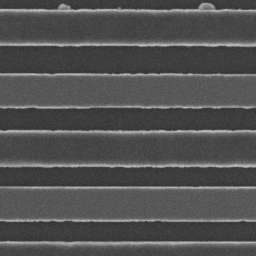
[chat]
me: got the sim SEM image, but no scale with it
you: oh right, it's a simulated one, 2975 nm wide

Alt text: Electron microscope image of lines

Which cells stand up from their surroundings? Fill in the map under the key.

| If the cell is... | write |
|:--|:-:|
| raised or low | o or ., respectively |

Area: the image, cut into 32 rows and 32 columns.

................................
oooooooooooooooooooooooooooooooo
oooooooooooooooooooooooooooooooo
oooooooooooooooooooooooooooooooo
oooooooooooooooooooooooooooooooo
oooooooooooooooooooooooooooooooo
................................
................................
................................
oooooooooooooooooooooooooooooooo
oooooooooooooooooooooooooooooooo
oooooooooooooooooooooooooooooooo
oooooooooooooooooooooooooooooooo
................................
................................
................................
oooooooooooooooooooooooooooooooo
oooooooooooooooooooooooooooooooo
oooooooooooooooooooooooooooooooo
oooooooooooooooooooooooooooooooo
oooooooooooooooooooooooooooooooo
................................
................................
ooooooooooooooooooo.oooo.ooooooo
oooooooooooooooooooooooooooooooo
oooooooooooooooooooooooooooooooo
oooooooooooooooooooooooooooooooo
oooooooooooooooooooooooooooooooo
................................
................................
oooooooooooooooooooooooooooooooo
oooooooooooooooooooooooooooooooo